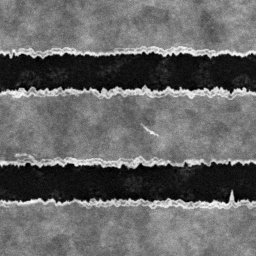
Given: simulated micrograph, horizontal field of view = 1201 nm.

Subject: one or a few lines or trenches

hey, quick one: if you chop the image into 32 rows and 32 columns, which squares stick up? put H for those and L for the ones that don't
HHHHHHHHHHHHHHHHHHHHHHHHHHHHHHHH
HHHHHHHHHHHHHHHHHHHHHHHHHHHHHHHH
HHHHHHHHHHHHHHHHHHHHHHHHHHHHHHHH
HHHHHHHHHHHHHHHHHHHHHHHHHHHHHHHH
HHHHHHHHHHHHHHHHHHHHHHHHHHHHHHHH
HHHHHHHHHHHHHHHHHHHHHHHHHHHHHHHH
HHHHHHHHHHHHHHHHHHHHHHHHHHHHHHHH
LLLLLLLLLLLLLLLLLLLLLLLLLLLLLLLL
LLLLLLLLLLLLLLLLLLLLLLLLLLLLLLLL
LLLLLLLLLLLLLLLLLLLLLLLLLLLLLLLL
LLLLLLLLLLLLLLLLLLLLLLLLLLLLLLLL
LLHHHHHHHHHHHHHHHHHLHHHHHHHHHHHL
HHHHHHHHHHHHHHHHHHHHHHHHHHHHHHHH
HHHHHHHHHHHHHHHHHHHHHHHHHHHHHHHH
HHHHHHHHHHHHHHHHHHHHHHHHHHHHHHHH
HHHHHHHHHHHHHHHHHHHHHHHHHHHHHHHH
HHHHHHHHHHHHHHHHHHHHHHHHHHHHHHHH
HHHHHHHHHHHHHHHHHHHHHHHHHHHHHHHH
HHHHHHHHHHHHHHHHHHHHHHHHHHHHHHHH
HHHHHHHHHHHHHHHHHHHHHHHHHHHHHHHH
LLHLHHHLLHHLHHHHHLHLLHHLLLLLLLLL
LLLLLLLLLLLLLLLLLLLLLLLLLLLLLLLL
LLLLLLLLLLLLLLLLLLLLLLLLLLLLLLLL
LLLLLLLLLLLLLLLLLLLLLLLLLLLLLLLL
LLLLLLLLLLLLLLLLLLLLLLLLLLLLLLLL
HHHHHHHHHHHHHHHHHHHHHHHHHHHHHHHH
HHHHHHHHHHHHHHHHHHHHHHHHHHHHHHHH
HHHHHHHHHHHHHHHHHHHHHHHHHHHHHHHH
HHHHHHHHHHHHHHHHHHHHHHHHHHHHHHHH
HHHHHHHHHHHHHHHHHHHHHHHHHHHHHHHH
HHHHHHHHHHHHHHHHHHHHHHHHHHHHHHHH
HHHHHHHHHHHHHHHHHHHHHHHHHHHHHHHH